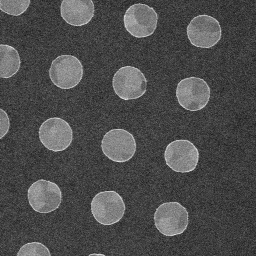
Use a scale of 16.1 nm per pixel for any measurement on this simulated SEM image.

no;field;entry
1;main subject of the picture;a regular array of raised bodies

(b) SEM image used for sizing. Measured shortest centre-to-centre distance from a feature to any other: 1010 nanometers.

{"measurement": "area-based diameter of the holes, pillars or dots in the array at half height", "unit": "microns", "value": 0.534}